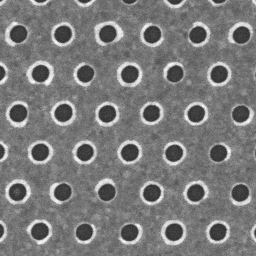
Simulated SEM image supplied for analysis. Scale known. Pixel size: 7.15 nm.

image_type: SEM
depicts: a regular array of holes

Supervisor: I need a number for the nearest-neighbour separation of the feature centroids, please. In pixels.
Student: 44.3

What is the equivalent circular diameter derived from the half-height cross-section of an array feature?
0.13 microns